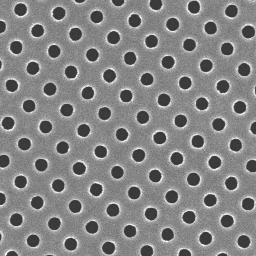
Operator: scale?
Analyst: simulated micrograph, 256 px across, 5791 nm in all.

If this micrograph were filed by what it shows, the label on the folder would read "a regular array of holes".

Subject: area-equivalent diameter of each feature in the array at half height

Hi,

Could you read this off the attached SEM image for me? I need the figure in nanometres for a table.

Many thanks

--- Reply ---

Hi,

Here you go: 296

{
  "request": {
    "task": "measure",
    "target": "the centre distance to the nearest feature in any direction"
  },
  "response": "601 nm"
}